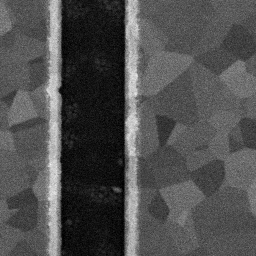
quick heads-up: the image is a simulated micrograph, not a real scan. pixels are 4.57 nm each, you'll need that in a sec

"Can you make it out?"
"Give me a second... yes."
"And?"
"one or a few lines or trenches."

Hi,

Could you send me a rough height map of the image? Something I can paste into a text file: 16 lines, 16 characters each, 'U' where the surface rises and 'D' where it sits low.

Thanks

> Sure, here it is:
UUUDDDDDUUUUUUUU
UUUDDDDDUUUUUUUU
UUUDDDDDUUUUUUUU
UUUDDDDDUUUUUUUU
UUUDDDDDUUUUUUUU
UUUDDDDDUUUUUUUU
UUUDDDDDUUUUUUUU
UUUDDDDDUUUUUUUU
UUUDDDDDUUUUUUUU
UUUDDDDDUUUUUUUU
UUUDDDDDUUUUUUUU
UUUDDDDDUUUUUUUU
UUUDDDDDUUUUUUUU
UUUDDDDDUUUUUUUU
UUUDDDDDUUUUUUUU
UUUDDDDDUUUUUUUU